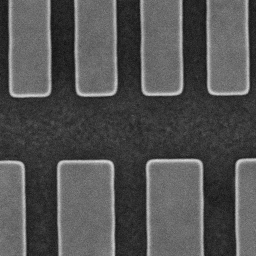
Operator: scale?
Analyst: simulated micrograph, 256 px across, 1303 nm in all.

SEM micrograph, groups of lines, slits or small figures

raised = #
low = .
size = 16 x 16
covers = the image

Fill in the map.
.##..##..##..##.
.##..##..##..##.
.##..##..##..##.
.##..##..##..###
.##..##..##..###
.##..##..##..##.
................
................
................
................
#...###..####..#
#...###..####..#
##..###..####..#
##..###..####..#
##..###..####..#
##..###..####..#